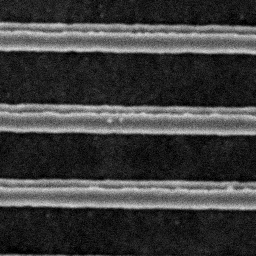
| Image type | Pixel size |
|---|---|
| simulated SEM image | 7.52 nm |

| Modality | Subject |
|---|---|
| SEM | lines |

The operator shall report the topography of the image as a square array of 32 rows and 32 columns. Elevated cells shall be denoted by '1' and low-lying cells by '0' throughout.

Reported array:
00000000000000000000000000000000
00000000000000000000000000000000
00000000000000000000000000000000
11111111111111111111111111111111
11111111111111111111111111111111
11111111111111111111111111111111
00000000000000100011111111111111
00000000000000000000000000000000
00000000000000000000000000000000
00000000000000000000000000000000
00000000000000000000000000000000
00000000000000000000000000000000
00000000000000000000000000000000
11111111111111111111111100000000
11111111111111111111111111111111
11111111111111111111111111111111
00000011001111111111111111111111
00000000000000000000000000000000
00000000000000000000000000000000
00000000000000000000000000000000
00000000000000000000000000000000
00000000000000000000000000000000
10000000000000000000000000000000
11111111111111111111111111111111
11111111111111111111111111111111
11111111111111111111111111111111
00000000000000000000000000000000
00000000000000000000000000000000
00000000000000000000000000000000
00000000000000000000000000000000
00000000000000000000000000000000
00000000000000000000000000000000